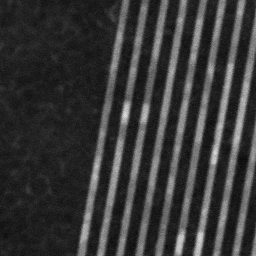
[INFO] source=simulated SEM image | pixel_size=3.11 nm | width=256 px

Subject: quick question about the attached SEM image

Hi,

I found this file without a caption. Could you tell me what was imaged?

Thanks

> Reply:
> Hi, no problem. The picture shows parallel lines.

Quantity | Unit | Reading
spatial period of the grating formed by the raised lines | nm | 59.1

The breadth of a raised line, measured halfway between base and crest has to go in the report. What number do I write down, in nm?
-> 16.4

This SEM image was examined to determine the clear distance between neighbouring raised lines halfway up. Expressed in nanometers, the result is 44.1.